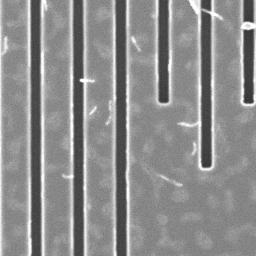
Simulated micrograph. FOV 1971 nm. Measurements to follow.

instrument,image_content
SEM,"parallel lines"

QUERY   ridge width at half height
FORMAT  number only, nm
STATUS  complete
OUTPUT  241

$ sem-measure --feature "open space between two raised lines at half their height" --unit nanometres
89.5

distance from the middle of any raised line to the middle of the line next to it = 328 nanometers